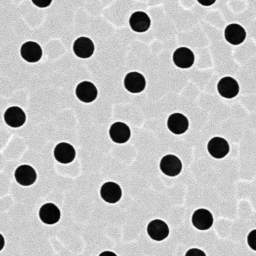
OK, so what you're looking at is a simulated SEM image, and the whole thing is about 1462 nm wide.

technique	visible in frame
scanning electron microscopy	a regular array of holes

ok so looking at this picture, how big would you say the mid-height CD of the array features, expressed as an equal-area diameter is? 125 nm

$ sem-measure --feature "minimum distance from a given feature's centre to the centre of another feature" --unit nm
268